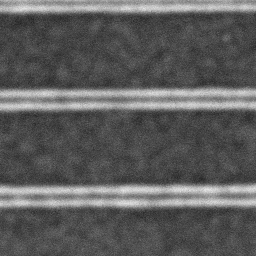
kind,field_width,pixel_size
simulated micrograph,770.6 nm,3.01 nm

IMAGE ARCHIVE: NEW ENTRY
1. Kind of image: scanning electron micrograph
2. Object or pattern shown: one or a few lines or trenches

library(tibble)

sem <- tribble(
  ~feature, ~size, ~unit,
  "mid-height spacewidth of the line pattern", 253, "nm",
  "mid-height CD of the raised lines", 0.0399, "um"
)